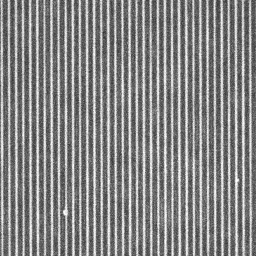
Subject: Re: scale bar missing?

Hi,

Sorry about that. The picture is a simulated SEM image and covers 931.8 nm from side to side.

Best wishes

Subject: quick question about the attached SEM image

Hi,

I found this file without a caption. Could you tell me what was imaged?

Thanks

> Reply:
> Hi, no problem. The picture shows parallel lines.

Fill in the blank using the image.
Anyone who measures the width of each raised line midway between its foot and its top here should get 6.8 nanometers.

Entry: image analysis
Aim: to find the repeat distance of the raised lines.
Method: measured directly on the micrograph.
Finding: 25.8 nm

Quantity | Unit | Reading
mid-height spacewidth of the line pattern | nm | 20.5